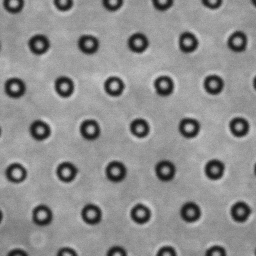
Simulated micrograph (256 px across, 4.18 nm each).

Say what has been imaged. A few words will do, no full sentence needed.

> a regular array of ring-shaped grooves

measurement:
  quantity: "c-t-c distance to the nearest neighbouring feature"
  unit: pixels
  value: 48.9